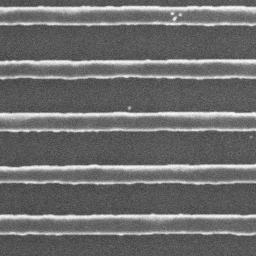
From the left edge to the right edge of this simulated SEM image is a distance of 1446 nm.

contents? lines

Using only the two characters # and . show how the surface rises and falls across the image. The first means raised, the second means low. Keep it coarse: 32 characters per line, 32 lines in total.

................................
################################
################################
................................
................................
................................
................................
................................
################################
################################
................................
................................
................................
................................
################################
################################
................................
................................
................................
................................
................................
################################
################################
................................
................................
................................
................................
################################
################################
................................
................................
................................